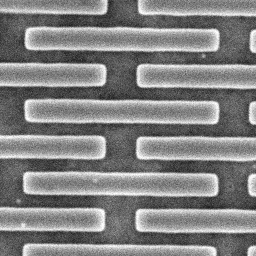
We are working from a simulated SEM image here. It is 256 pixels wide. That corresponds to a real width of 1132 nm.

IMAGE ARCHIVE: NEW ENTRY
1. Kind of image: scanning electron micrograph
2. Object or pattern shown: groups of lines, slits or small figures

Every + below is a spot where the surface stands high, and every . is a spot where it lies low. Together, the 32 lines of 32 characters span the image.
+++++++++++++....+++++++++++++++
..+++++++++++.....++++++++++++++
................................
....+++.+++++.++................
...++++++++++++++++++++++++....+
...++++++++++++++++++++++++....+
................................
................................
+++++++++++++....+++++++++++++++
+++++++++++++....+++++++++++++++
+++++++++++++....+++++++++++++++
................................
................................
...++++++++++++++++++++++++....+
...++++++++++++++++++++++++....+
................................
................................
+++++++++++++....+++++++++++++++
+++++++++++++....+++++++++++++++
+++++++++++++....+++++++++++++++
................................
................................
...++++++++++++++++++++++++....+
...++++++++++++++++++++++++....+
................................
................................
+++++++++++++....+++++++++++++++
+++++++++++++....+++++++++++++++
+++++++++++++....+++++++++++++++
................................
................................
...++++++++++++++++++++++++....+